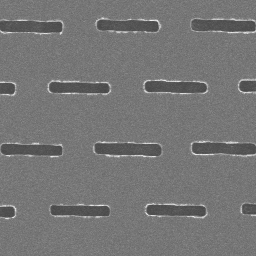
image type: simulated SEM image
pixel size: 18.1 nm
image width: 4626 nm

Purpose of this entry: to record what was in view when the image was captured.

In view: holes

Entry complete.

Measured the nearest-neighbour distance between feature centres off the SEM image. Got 1.41 microns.